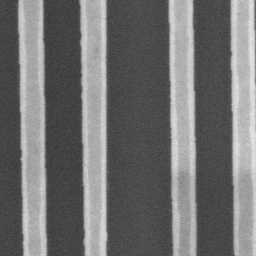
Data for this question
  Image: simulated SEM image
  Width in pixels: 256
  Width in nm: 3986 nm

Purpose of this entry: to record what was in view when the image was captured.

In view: lines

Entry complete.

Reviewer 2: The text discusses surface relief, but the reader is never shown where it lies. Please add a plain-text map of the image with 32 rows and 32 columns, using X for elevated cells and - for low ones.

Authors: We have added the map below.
--XXX-----XXX--------XXX-----XX-
---XX-----XXX--------XXX-----XX-
---XX-----XXX--------XXX-----XX-
---XX-----XXX--------XXX-----XX-
---XX-----XXX--------XXX-----XX-
---XX-----XXX---------XX-----XX-
---XX-----XXX---------XX-----XXX
---XX-----XXX---------XX-----XXX
---XX-----XXX---------XX-----XXX
---XX-----XXX---------XX-----XXX
---XX-----XXX---------XX-----XXX
---XX-----XXX---------XX-----XXX
---XX-----XXX---------XX-----XXX
---XX-----XXX---------XX-----XXX
---XX------XX---------XX-----XXX
---XX------XX---------XX-----XXX
---XX------XX---------XX-----XXX
---XX------XX---------XX-----XXX
---XX------XX---------XX-----XXX
---XX------XX---------XX-----XXX
---XX------XX---------XX-----XXX
---XX------XX---------XX-----XXX
---XX------XX---------XX-----XXX
---XX------XX---------XX-----XXX
---XX------XX---------XX-----XXX
---XX------XX---------XX-----XXX
---XX------XX---------XX-----XXX
---XX------XX---------XX-----XXX
---XX------XX---------XX-----XXX
---XXX-----XX---------XX-----XXX
---XXX-----XX---------XX-----XXX
---XXX-----XX---------XX-----XXX